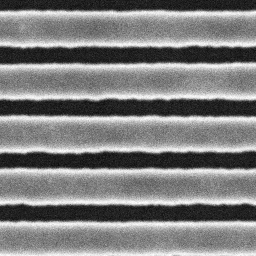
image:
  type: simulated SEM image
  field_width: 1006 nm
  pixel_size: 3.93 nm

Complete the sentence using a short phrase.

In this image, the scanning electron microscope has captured lines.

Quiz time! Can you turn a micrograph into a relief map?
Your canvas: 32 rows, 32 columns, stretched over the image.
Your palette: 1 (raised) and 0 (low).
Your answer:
00000000000000000000000000000000
11111111111111111111111111111111
11111111111111111111111111111111
11111111111111111111111111111111
11111111111111111111111111111111
11111111111111111111111111111111
00000000000000000000000000000000
00000000000000000000000000000000
11111111111111111111111111111111
11111111111111111111111111111111
11111111111111111111111111111111
11111111111111111111111111111111
00000000000000000000000000000000
00000000000000000000000000000000
00000000000000000000000000000000
11111111111111111111111111111111
11111111111111111111111111111111
11111111111111111111111111111111
11111111111111111111111111111111
00000000000000000000000000000000
00000000000000000000000000000000
11111111111111111111111111111111
11111111111111111111111111111111
11111111111111111111111111111111
11111111111111111111111111111111
11011111111111111111111100110101
00000000000000000000000000000000
00000000000000000000000000000000
11111111111111111111111111111111
11111111111111111111111111111111
11111111111111111111111111111111
11111111111111111111111111111111